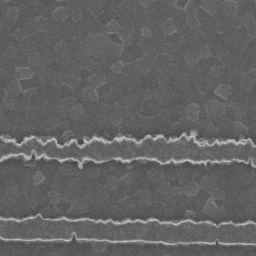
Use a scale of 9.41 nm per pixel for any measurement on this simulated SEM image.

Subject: one or a few lines or trenches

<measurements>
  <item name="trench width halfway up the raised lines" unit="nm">572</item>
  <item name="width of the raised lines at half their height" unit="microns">0.189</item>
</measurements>